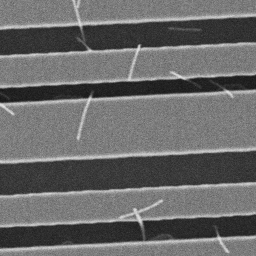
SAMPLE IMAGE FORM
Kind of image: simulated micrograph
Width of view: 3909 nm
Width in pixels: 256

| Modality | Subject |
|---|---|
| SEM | lines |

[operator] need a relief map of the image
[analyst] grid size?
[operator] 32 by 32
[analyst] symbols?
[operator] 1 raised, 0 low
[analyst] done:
11111111111111111111111111111111
11111111111111111111111111111111
11111111111111111111111100000000
11110000000000000000000000000000
00000000000000000000000000000000
00000000000000000000000000000111
00000000001111111111111111111111
11111111111111111111111111111111
11111111111111111111111111111111
11111111111111111111111111110000
11111111000000000000000000000000
00000000000000000000000000111111
00000001111111111111111111111111
11111111111111111111111111111111
11111111111111111111111111111111
11111111111111111111111111111111
11111111111111111111111111111111
11111111111111111111111111111111
11111111111111111111111111111111
11111111111111111100000000000000
00000000000000000000000000000000
00000000000000000000000000000000
00000000000000000000000000000000
00000000000000000111111111111111
11111111111111111111111111111111
11111111111111111111111111111111
11111111111111111111111111111111
11111111111111111100000000000000
00000000000000000000000000000000
00000000000000000000000000000001
00000000000011111111111111111111
11111111111111111111111111111111